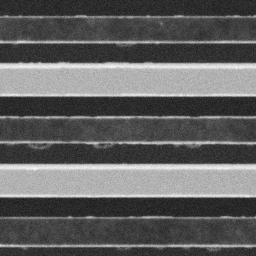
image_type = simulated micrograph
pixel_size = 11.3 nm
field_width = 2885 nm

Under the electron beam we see lines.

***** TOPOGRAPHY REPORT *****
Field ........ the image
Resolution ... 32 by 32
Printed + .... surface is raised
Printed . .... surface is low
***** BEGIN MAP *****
................................
................................
++++++++++++++++++++++++++++++++
++++++++++++++++++++++++++++++++
++++++++++++++++++++++++++++++++
................................
................................
................................
++++++++++++++++++++++++++++++++
++++++++++++++++++++++++++++++++
++++++++++++++++++++++++++++++++
++++++++++++++++++++++++++++++++
................................
................................
................................
++++++++++++++++++++++++++++++++
++++++++++++++++++++++++++++++++
++++++++++++++++++++++++++++++++
................................
................................
................................
++++++++++++++++++++++++++++++++
++++++++++++++++++++++++++++++++
++++++++++++++++++++++++++++++++
++++++++++++++++++++++++++++++++
................................
................................
++++++++++++++++++++++++++++++++
++++++++++++++++++++++++++++++++
++++++++++++++++++++++++++++++++
++++++++++++++++++++++++++++++++
................................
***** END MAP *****